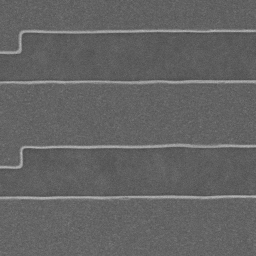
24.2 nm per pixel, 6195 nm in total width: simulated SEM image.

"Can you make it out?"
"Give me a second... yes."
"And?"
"wiring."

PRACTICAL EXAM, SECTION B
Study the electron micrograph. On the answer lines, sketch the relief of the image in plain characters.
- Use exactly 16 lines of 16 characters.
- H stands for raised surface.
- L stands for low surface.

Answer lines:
HHHHHHHHHHHHHHHH
HHHHHHHHHHHHHHHH
HLLLLLLLLLLLLLLL
LLLLLLLLLLLLLLLL
LLLLLLLLLLLLLLLL
HHHHHHHHHHHHHHHH
HHHHHHHHHHHHHHHH
HHHHHHHHHHHHHHHH
HHHHHHHHHHHHHHHH
HLLLLLLLLLLLLLLL
LLLLLLLLLLLLLLLL
LLLLLLLLLLLLLLLL
HHHHHHHHHHHHHHHH
HHHHHHHHHHHHHHHH
HHHHHHHHHHHHHHHH
HHHHHHHHHHHHHHHH